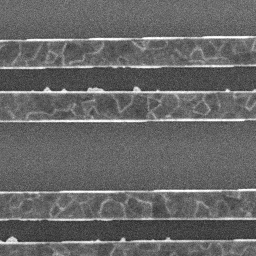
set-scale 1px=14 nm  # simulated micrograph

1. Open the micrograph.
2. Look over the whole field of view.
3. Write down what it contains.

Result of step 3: lines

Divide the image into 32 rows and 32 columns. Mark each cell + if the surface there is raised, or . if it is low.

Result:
................................
................................
................................
................................
................................
++++++++++++++++++++++++++++++++
++++++++++++++++++++++++++++++++
++++++++++++++++++++++++++++++++
+++++...........................
................................
................................
++++++++++++++++++++++++++++++++
++++++++++++++++++++++++++++++++
++++++++++++++++++++++++++++++++
++++++++++++++++++++++++++++++++
................................
................................
................................
................................
................................
................................
................................
................................
................................
++++++++++++++++++++++++++++++++
++++++++++++++++++++++++++++++++
++++++++++++++++++++++++++++++++
................................
................................
................................
++++++++++++++++++++++++++++++++
++++++++++++++++++++++++++++++++